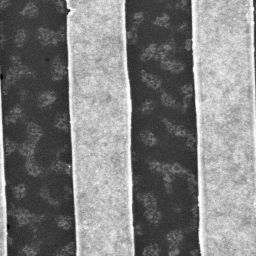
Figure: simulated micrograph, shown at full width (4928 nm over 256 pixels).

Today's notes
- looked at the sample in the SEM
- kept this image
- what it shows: one or a few lines or trenches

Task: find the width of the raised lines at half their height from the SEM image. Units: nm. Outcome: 1100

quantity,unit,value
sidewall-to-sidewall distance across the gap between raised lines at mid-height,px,69.6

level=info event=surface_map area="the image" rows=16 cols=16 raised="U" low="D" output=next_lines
DDDDUUUUDDDDUUUU
DDDDUUUUDDDDUUUU
DDDDUUUUDDDDUUUU
DDDDUUUUDDDDUUUU
DDDDUUUUDDDDUUUU
DDDDUUUUDDDDUUUU
DDDDUUUUDDDDUUUU
DDDDUUUUDDDDUUUU
DDDDDUUUDDDDUUUU
DDDDDUUUDDDDUUUU
DDDDDUUUDDDDUUUU
DDDDDUUUDDDDUUUU
DDDDDUUUDDDDDUUU
DDDDDUUUDDDDDUUU
DDDDDUUUDDDDDUUU
DDDDDUUUDDDDDUUU